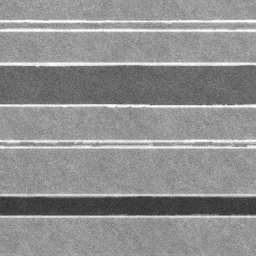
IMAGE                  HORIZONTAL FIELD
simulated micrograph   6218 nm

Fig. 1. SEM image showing lines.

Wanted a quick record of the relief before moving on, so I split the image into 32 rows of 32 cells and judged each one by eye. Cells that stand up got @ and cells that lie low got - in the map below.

@@@@@@@@@@@@@@@@@@@@@@@@@@@@@@@@
@@@@@@@@@@@@@@@@@@@@@@@@@@@@@@@@
@@@@@@@@@@@@@@@@@@@@@@@@@@@@@@@@
@@@@@@@@@@@@@@@@@@@@@@@@@@@@@@@@
@@@@@@@@@@@@@@@@@@@@@@@@@@@@@@@@
@@@@@@@@@@@@@@@@@@@@@@@@@@@@@@@@
@@@@@@@@@@@@@@@@@@@@@@@@@@@@@@@@
@@@@@@@@@@@@@@@@@@@@@@@@@@@@@@@@
--------------------------------
--------------------------------
--------------------------------
--------------------------------
--------------------------------
@@@@@@@@@@@@@@@@@@@@@@@@@@@@@@@@
@@@@@@@@@@@@@@@@@@@@@@@@@@@@@@@@
@@@@@@@@@@@@@@@@@@@@@@@@@@@@@@@@
@@@@@@@@@@@@@@@@@@@@@@@@@@@@@@@@
@@@@@@@@@@@@@@@@@@@@@@@@@@@@@@@@
@@@@@@@@@@@@@@@@@@@@@@@@@@@@@@@@
@@@@@@@@@@@@@@@@@@@@@@@@@@@@@@@@
@@@@@@@@@@@@@@@@@@@@@@@@@@@@@@@@
@@@@@@@@@@@@@@@@@@@@@@@@@@@@@@@@
@@@@@@@@@@@@@@@@@@@@@@@@@@@@@@@@
@@@@@@@@@@@@@@@@@@@@@@@@@@@@@@@@
--------------------------------
--------------------------------
--------------------------------
@@@@@@@@@@@@@@@@@@@@@@@@@@@@@@@@
@@@@@@@@@@@@@@@@@@@@@@@@@@@@@@@@
@@@@@@@@@@@@@@@@@@@@@@@@@@@@@@@@
@@@@@@@@@@@@@@@@@@@@@@@@@@@@@@@@
@@@@@@@@@@@@@@@@@@@@@@@@@@@@@@@@